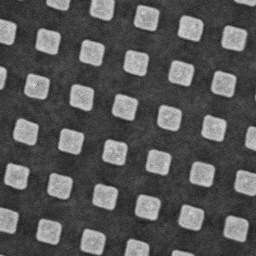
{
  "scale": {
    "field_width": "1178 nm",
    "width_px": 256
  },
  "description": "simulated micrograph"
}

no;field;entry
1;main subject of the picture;a regular array of raised bodies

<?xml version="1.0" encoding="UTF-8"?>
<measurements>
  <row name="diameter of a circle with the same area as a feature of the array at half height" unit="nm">115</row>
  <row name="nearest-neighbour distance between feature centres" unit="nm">206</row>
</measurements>